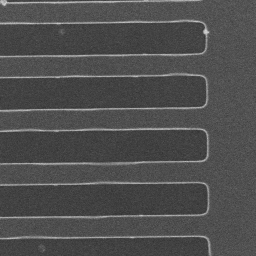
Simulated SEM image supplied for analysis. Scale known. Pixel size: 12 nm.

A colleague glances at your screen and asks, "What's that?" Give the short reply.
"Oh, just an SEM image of groups of lines, slits or small figures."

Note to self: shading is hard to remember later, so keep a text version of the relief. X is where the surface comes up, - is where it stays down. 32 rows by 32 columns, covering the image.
XXXXXXXXXXXXXXXXXXXXXXXXXXXXXXXX
XXXXXXXXXXXXXXXXXXXXXXXXXXXXXXXX
XXXXXXXXXXXXXXXXXXXXXXXXXXXXXXXX
--------------------------XXXXXX
--------------------------XXXXXX
--------------------------XXXXXX
-------------------------XXXXXXX
XXXXXXXXXXXXXXXXXXXXXXXXXXXXXXXX
XXXXXXXXXXXXXXXXXXXXXXXXXXXXXXXX
XXXXXXXX-----------------XXXXXXX
--------------------------XXXXXX
--------------------------XXXXXX
--------------------------XXXXXX
------------------------XXXXXXXX
XXXXXXXXXXXXXXXXXXXXXXXXXXXXXXXX
XXXXXXXXXXXXXXXXXXXXXXXXXXXXXXXX
--------------------------XXXXXX
--------------------------XXXXXX
--------------------------XXXXXX
--------------------------XXXXXX
----------------XXXXXXXXXXXXXXXX
XXXXXXXXXXXXXXXXXXXXXXXXXXXXXXXX
XXXXXXXXXXXXXXXXXXXXXXXXXXXXXXXX
--------------------------XXXXXX
--------------------------XXXXXX
--------------------------XXXXXX
--------------------------XXXXXX
XXXXXXXXXXXXXXXXXXXXXXXXXXXXXXXX
XXXXXXXXXXXXXXXXXXXXXXXXXXXXXXXX
XXXXXXXXXXXXXXXXXXXXXXXXXXXXXXXX
--------------------------XXXXXX
--------------------------XXXXXX